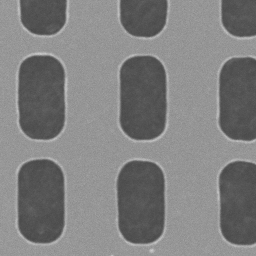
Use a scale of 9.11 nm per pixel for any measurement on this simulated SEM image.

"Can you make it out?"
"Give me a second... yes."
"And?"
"holes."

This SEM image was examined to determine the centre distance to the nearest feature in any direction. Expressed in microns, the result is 0.917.